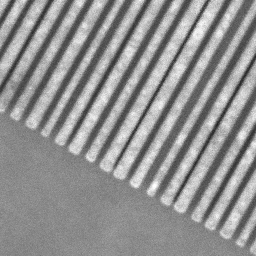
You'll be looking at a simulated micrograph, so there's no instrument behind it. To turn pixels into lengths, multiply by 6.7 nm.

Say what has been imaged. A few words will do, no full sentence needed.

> parallel lines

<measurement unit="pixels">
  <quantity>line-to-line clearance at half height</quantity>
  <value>8.16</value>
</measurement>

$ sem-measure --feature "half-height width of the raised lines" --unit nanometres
66.3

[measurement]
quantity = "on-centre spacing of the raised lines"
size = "0.114 micrometres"